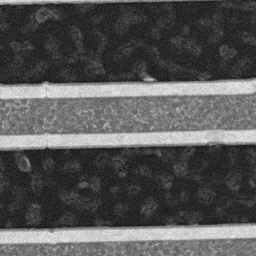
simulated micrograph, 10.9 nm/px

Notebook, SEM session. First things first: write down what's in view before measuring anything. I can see one or a few lines or trenches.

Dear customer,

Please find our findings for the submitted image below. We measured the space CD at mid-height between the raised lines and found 1050 nm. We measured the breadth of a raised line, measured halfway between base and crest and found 0.526 microns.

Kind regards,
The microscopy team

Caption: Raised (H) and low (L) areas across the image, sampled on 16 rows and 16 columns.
LLLLLLLLLLLLLLLL
LLLLLLLLLLLLLLLL
LLLLLLLLLLLLLLLL
LLLLLLLLLLLLLLLL
LLLLLLLLLLLLLLLL
LLLLLLLLLLLLLLLL
HHHHHHHHHHHHHHHH
HHHHHHHHHHHHHHHH
HHHHHHHHHHHHHLLL
LLLLLLLLLLLLLLLL
LLLLLLLLLLLLLLLL
LLLLLLLLLLLLLLLL
LLLLLLLLLLLLLLLL
LLLLLLLLLLLLLLLL
LLLLLLLLLLLLLLLL
HHHHHHHHHHHHHHHH